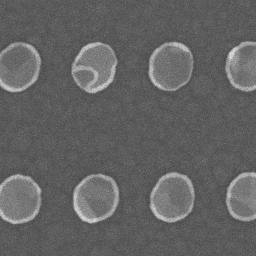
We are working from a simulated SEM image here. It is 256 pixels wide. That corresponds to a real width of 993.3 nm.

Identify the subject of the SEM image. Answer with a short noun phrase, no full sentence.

raised bodies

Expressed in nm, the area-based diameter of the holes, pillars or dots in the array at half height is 180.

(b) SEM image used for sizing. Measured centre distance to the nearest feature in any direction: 296 nm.